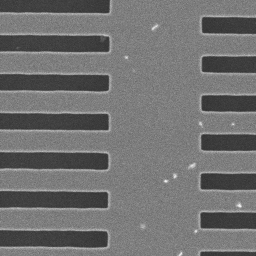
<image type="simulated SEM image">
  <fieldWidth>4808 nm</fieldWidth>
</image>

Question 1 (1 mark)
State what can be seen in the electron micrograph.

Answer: groups of lines, slits or small figures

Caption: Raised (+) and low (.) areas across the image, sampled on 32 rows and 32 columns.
..............++++++++++++++++++
..............++++++++++++++++++
+++++++++++++++++++++++++.......
+++++++++++++++++++++++++.......
.............+++++++++++++++++++
..............++++++++++++++++++
.............+++++++++++++++++++
+++++++++++++++++++++++++.......
+++++++++++++++++++++++++.......
.............+++++++++++++++++++
..............++++++++++++++++++
+++++++++++..+++++++++++++++++++
+++++++++++++++++++++++++.......
+++++++++++++++++++++++++.......
.............+++++++++++++++++++
..............++++++++++++++++++
++++++++++++++++++++++++++++++++
+++++++++++++++++++++++++.......
+++++++++++++++++++++++++.......
.............+++++++++++++++++++
..............++++++++++++++++++
++++++++++++++++++++++++++++++++
+++++++++++++++++++++++++.......
+++++++++++++++++++++++++.......
..............++++++++++++++++++
..............++++++++++++++++++
++++++++++++++++++++++++++++++++
+++++++++++++++++++++++++.......
+++++++++++++++++++++++++.......
..............++++++++++++++++++
.............+++++++++++++++++++
+++++++++++++++++++++++++.......